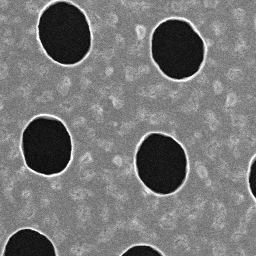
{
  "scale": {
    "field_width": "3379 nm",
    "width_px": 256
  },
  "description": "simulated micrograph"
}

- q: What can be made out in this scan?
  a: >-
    holes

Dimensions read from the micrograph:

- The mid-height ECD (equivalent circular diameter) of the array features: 736 nanometres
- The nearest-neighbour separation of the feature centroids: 1.51 um